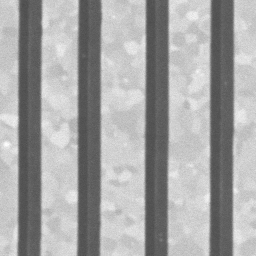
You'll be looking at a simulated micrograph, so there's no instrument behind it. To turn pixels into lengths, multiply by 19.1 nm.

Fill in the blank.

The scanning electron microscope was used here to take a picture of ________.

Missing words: lines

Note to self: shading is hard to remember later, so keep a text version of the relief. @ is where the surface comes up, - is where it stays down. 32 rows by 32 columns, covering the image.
@@---@@@@@---@@@@@---@@@@@---@@@
@@---@@@@@---@@@@@---@@@@@---@@@
@@---@@@@@---@@@@@---@@@@@---@@@
@@---@@@@@---@@@@@---@@@@@---@@@
@@---@@@@@---@@@@@---@@@@@---@@@
@@---@@@@@---@@@@@---@@@@@---@@@
@@---@@@@@---@@@@@---@@@@@---@@@
@@---@@@@@---@@@@@---@@@@@---@@@
@@---@@@@@---@@@@@---@@@@@---@@@
@@---@@@@@---@@@@@---@@@@@---@@@
@@---@@@@@---@@@@@---@@@@@---@@@
@@---@@@@@---@@@@@---@@@@@---@@@
@@---@@@@@---@@@@@---@@@@@---@@@
@@---@@@@@---@@@@@---@@@@@---@@@
@@---@@@@@---@@@@@---@@@@@---@@@
@@---@@@@@---@@@@@---@@@@@---@@@
@@---@@@@@---@@@@@---@@@@@---@@@
@@---@@@@@---@@@@@---@@@@@---@@@
@@---@@@@@---@@@@@---@@@@@---@@@
@@---@@@@@---@@@@@---@@@@@---@@@
@@---@@@@@---@@@@@---@@@@@---@@@
@@---@@@@@---@@@@@---@@@@@---@@@
@@---@@@@@---@@@@@---@@@@@---@@@
@@---@@@@@---@@@@@---@@@@@---@@@
@@---@@@@@---@@@@@---@@@@@---@@@
@@---@@@@@---@@@@@---@@@@@---@@@
@@---@@@@@---@@@@@---@@@@@---@@@
@@---@@@@@---@@@@@---@@@@@---@@@
@@---@@@@@---@@@@@---@@@@@---@@@
@@---@@@@@---@@@@@---@@@@@---@@@
@@---@@@@@---@@@@@---@@@@@---@@@
@@---@@@@@---@@@@@---@@@@@---@@@